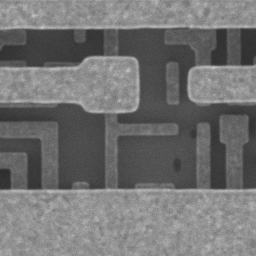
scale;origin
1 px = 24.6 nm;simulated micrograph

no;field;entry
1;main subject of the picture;wiring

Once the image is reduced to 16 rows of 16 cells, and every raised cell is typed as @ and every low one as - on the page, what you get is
@@@@@@@@@@@@@@@@
@@@@@@@@@@@@@@@@
----------------
----------------
@@@@@@@@@---@@@@
@@@@@@@@@---@@@@
-----@@@@-------
----------------
----------------
----------------
----------------
----------------
@@@@@@@@@@@@@@@@
@@@@@@@@@@@@@@@@
@@@@@@@@@@@@@@@@
@@@@@@@@@@@@@@@@